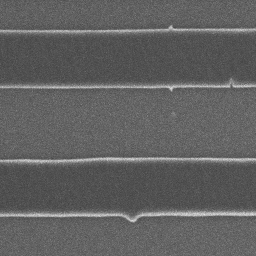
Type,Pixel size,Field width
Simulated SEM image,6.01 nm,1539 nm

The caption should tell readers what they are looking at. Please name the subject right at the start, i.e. one or a few lines or trenches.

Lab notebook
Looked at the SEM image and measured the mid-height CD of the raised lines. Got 344 nm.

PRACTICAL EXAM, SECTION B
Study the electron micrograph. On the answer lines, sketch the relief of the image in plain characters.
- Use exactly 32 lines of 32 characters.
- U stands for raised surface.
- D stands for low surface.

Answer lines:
DDDDDDDDDDDDDDDDDDDDDDDDDDDDDDDD
DDDDDDDDDDDDDDDDDDDDDDDDDDDDDDDD
DDDDDDDDDDDDDDDDDDDDDDDDDDDDDDDD
DDDDDDDDDDDDDDDDDDDDDUDDDDDDDDDD
UUUUUUUUUUUUUUUUUUUUUUUUUUUUUUUU
UUUUUUUUUUUUUUUUUUUUUUUUUUUUUUUU
UUUUUUUUUUUUUUUUUUUUUUUUUUUUUUUU
UUUUUUUUUUUUUUUUUUUUUUUUUUUUUUUU
UUUUUUUUUUUUUUUUUUUUUUUUUUUUUUUU
UUUUUUUUUUUUUUUUUUUUUUUUUUUUUUUU
UUUUUUUUUUUUUUUUUUUUUUUUUUUUUUUU
DDDDDDDDDDDDDDDDDDDDDDDDDDDDDDDD
DDDDDDDDDDDDDDDDDDDDDDDDDDDDDDDD
DDDDDDDDDDDDDDDDDDDDDDDDDDDDDDDD
DDDDDDDDDDDDDDDDDDDDDDDDDDDDDDDD
DDDDDDDDDDDDDDDDDDDDDDDDDDDDDDDD
DDDDDDDDDDDDDDDDDDDDDDDDDDDDDDDD
DDDDDDDDDDDDDDDDDDDDDDDDDDDDDDDD
DDDDDDDDDDDDDDDDDDDDDDDDDDDDDDDD
DDDDDDDDDDDDDDDDDDDDDDDDDDDDDDDD
UUUUUUUUUUUUUUUUUUUUUUUUUUUUUUUU
UUUUUUUUUUUUUUUUUUUUUUUUUUUUUUUU
UUUUUUUUUUUUUUUUUUUUUUUUUUUUUUUU
UUUUUUUUUUUUUUUUUUUUUUUUUUUUUUUU
UUUUUUUUUUUUUUUUUUUUUUUUUUUUUUUU
UUUUUUUUUUUUUUUUUUUUUUUUUUUUUUUU
UUUUUUUUUUUUUUUUUUUUUUUUUUUUUUUU
DDDDDDDDDDDDDDDDUDDDDDDDDDDDDDDD
DDDDDDDDDDDDDDDDDDDDDDDDDDDDDDDD
DDDDDDDDDDDDDDDDDDDDDDDDDDDDDDDD
DDDDDDDDDDDDDDDDDDDDDDDDDDDDDDDD
DDDDDDDDDDDDDDDDDDDDDDDDDDDDDDDD